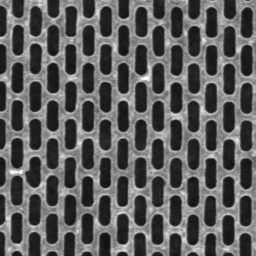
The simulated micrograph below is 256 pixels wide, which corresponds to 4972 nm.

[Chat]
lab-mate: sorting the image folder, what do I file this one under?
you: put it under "a regular array of holes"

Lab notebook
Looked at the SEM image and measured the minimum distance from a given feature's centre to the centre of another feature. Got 494 nm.